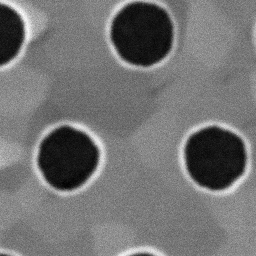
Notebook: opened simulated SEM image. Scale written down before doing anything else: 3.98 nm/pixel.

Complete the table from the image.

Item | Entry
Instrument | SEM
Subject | holes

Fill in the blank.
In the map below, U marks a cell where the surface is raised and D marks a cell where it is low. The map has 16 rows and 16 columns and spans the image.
DUUUUUUUDDUUUUUU
DDUUUUUDDDDUUUUU
DDUUUUUDDDDUUUUU
DUUUUUUDDDUUUUUU
UUUUUUUUUUUUUUUU
UUUUUUUUUUUUUUUU
UUUUUUUUUUUUUUUU
UUUUUUUUUUUUUUUU
UUUDDDUUUUUUDDDU
UUDDDDUUUUUDDDDU
UUDDDDUUUUUUDDDU
UUUDDUUUUUUUDDDU
UUUUUUUUUUUUUUUU
UUUUUUUUUUUUUUUU
UUUUUUUUUUUUUUUU
UUUUUUUUUUUUUUUU